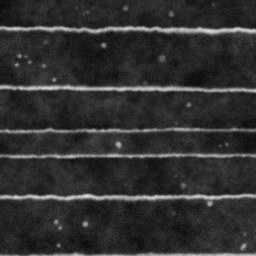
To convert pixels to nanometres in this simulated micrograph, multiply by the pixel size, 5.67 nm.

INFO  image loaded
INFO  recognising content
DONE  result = lines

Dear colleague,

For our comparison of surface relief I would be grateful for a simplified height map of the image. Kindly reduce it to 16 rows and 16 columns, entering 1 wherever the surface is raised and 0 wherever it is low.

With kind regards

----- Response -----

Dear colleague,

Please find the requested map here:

0000000000000000
0000000000000000
1111111111111111
1111111111111111
1111111111111111
1111111111111111
0000000000000000
0000000000000000
1111111111111111
1111111111111111
0000000000000000
0000000000000000
1111111111111111
1111111111111111
1111111111111111
1111111111111111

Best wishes